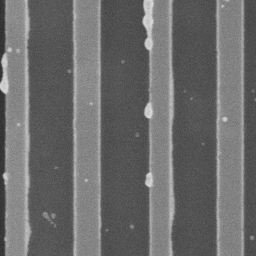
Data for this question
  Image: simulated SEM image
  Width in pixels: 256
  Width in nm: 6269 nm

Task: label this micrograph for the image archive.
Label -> lines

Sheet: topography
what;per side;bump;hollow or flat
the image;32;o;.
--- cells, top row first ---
.oo......ooo......ooo......ooo..
.oo......ooo......ooo......ooo..
.oo......ooo......ooo......ooo..
.oo......ooo......ooo......ooo..
.oo......ooo......ooo......ooo..
.oo......ooo......ooo......ooo..
.oo......ooo.......oo......ooo..
ooo......ooo.......oo......ooo..
ooo......ooo.......oo......ooo..
ooo......ooo.......oo......ooo..
ooo......ooo.......oo......ooo..
ooo......ooo.......oo......ooo..
.oo......ooo.......oo......ooo..
.oo......ooo......ooo......ooo..
.oo......ooo......ooo......ooo..
.oo......ooo.......oo......ooo..
.oo......ooo.......oo......ooo..
.oo......ooo.......oo......ooo..
.oo......ooo.......oo......ooo..
.oo......ooo.......oo......ooo..
.oo......ooo.......oo......ooo..
.oo......ooo.......oo......ooo..
.oo......ooo......ooo......ooo..
.oo......ooo.......oo......ooo..
.oo......ooo.......oo......ooo..
.oo......ooo.......oo......ooo..
.oo......ooo.......oo......ooo..
.oo......ooo.......oo......ooo..
.oo......ooo.......oo......ooo..
.oo......ooo.......oo......ooo..
.oo......ooo.......oo......ooo..
.oo......ooo.......oo......ooo..